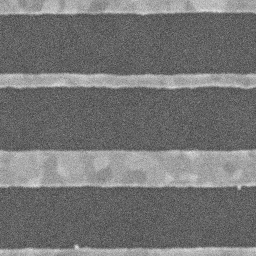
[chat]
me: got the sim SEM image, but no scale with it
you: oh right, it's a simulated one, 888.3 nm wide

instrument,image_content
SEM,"lines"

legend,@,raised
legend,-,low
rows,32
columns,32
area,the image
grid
@@@@@@@@@@@@@@@@@@@@@@@@@@@@@@@@
@@@@@@@@@@@@@@@@@@@@@@@@@--@@@-@
--------------------------------
--------------------------------
--------------------------------
--------------------------------
--------------------------------
--------------------------------
--------------------------------
@@@@@@@@@@@@@@----@---@@@@@@@@@@
@@@@@@@@@@@@@@@@@@@@@@@@@@@@@@@@
--------------------------------
--------------------------------
--------------------------------
--------------------------------
--------------------------------
--------------------------------
--------------------------------
--------------------------------
@@@@@@@@@@@@@@@@@@@@@@@@@@@@@@@@
@@@@@@@@@@@@@@@@@@@@@@@@@@@@@@@@
@@@@@@@@@@@@@@@@@@@@@@@@@@@@@@@@
@@@@@@@@@@@@@@@@@@@@@@@@@@@@@@@@
--------------------------------
--------------------------------
--------------------------------
--------------------------------
--------------------------------
--------------------------------
--------------------------------
--------------------------------
@@@@@@@@@@@@@@@@@@@@@@@@@@@@@@@@